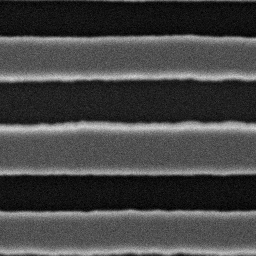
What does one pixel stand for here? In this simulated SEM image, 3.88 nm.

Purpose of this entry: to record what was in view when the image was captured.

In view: lines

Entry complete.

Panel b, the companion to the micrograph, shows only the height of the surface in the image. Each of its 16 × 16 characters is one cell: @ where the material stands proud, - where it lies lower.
----------------
----------------
@@@@@@@@@@@@@@@@
@@@@@@@@@@@@@@@@
@@@@@@@@@@@@@@@@
----------------
----------------
----------------
@@@@@@@@@@@@@@@@
@@@@@@@@@@@@@@@@
@@@@@@@@@@@@@@@@
----------------
----------------
@@@@@@@@@@@@@@@@
@@@@@@@@@@@@@@@@
@@@@@@@@@@@@@@@@